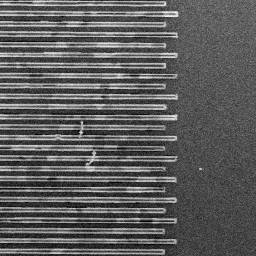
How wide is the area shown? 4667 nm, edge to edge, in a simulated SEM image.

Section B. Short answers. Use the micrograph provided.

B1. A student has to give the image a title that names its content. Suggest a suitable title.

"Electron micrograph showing parallel lines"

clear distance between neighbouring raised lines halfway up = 7.37 px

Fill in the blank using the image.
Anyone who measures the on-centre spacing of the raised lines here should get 188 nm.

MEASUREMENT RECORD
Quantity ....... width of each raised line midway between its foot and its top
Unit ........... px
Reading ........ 3.25